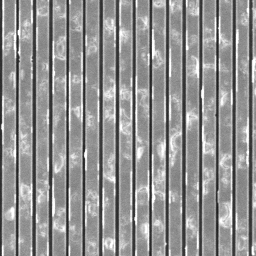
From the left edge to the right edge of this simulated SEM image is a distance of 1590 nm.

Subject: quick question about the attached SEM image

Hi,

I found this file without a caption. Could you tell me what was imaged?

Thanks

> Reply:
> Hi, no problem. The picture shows parallel lines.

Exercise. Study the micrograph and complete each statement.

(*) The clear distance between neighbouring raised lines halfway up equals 24.1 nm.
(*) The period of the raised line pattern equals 16.7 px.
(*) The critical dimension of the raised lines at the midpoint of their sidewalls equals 83.8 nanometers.